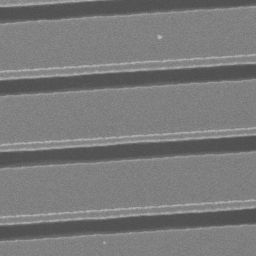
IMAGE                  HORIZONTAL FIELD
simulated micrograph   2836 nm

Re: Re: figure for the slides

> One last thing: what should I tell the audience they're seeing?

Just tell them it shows lines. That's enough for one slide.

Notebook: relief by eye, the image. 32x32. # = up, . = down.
######..........................
.......................#########
.......#########################
################################
################################
################################
################################
################################
########################........
#######.........................
.......................#########
.........#######################
################################
################################
################################
################################
################################
#######################.........
#########.......................
.......................#########
.........#######################
################################
################################
################################
################################
################################
########################........
#########.......................
..........................######
.........#######################
################################
################################